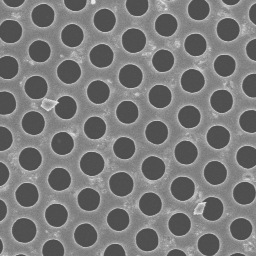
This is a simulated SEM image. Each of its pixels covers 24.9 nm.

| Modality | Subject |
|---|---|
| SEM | a regular array of holes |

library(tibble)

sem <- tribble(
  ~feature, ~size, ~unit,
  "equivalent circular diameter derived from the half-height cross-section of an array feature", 578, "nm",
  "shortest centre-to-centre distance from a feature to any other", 883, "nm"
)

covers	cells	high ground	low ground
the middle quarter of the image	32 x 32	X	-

----XXXX---XXXX---XXXX-----XXXXX
----XXXXXXXXXX-----XXXX---XXXXX-
----XXXXXXXXXX------XXXXXXXXXX--
----XXXXXXXXXX------XXXXXXXXX---
---XXXX---XXXX-----XXXXXXXXXX---
XXXXXX-----XXXX----XXX---XXXX---
XXXXXX-----XXXXXXXXXXX-----XXX--
XXXXXX-----XXXXXXXXXX------XXXXX
--XXXX-----XXXXXXXXXX------XXXXX
---XXXX---XXXXX--XXXX------XXXXX
---XXXXXXXXXX-----XXXX----XXXXX-
---XXXXXXXXXX------XXXXXXXXXX---
---XXXXXXXXXX------XXXXXXXXXX---
--XXXX---XXXX-----XXXXXXXXXXX---
XXXXX-----XXXX---XXXXX---XXXX---
XXXXX------XXXXXXXXXX-----XXXX--
XXXXX------XXXXXXXXX------XXXXXX
-XXXX-----XXXXXXXXXX------XXXXXX
--XXXX---XXXXX--XXXXX-----XXXXXX
--XXXXXXXXXXX----XXXXX---XXXX---
--XXXXXXXXXX------XXXXXXXXXX----
--XXXXXXXXXX------XXXXXXXXXX----
-XXXX----XXXX----XXXXXXXXXXX----
XXXX------XXXX---XXXX---XXXX----
XXXX------XXXXXXXXXX-----XXXX---
XXXX------XXXXXXXXX------XXXXXXX
-XXX------XXXXXXXXX------XXXXXXX
-XXXX----XXXX---XXXX-----XXXXXXX
--XXXXXXXXX------XXX----XXXX---X
--XXXXXXXXX------XXXXXXXXXX-----
-XXXXXXXXXX------XXXXXXXXXX-----
XXXXX---XXXX-----XXXXXXXXXX-----